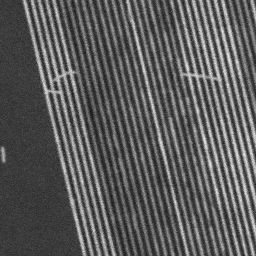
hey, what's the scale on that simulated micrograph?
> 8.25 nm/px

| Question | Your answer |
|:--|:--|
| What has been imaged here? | parallel lines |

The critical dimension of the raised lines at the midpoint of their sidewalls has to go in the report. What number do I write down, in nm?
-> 15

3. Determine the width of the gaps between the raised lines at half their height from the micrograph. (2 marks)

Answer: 5.35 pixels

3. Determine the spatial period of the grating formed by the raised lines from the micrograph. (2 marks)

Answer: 58.9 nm